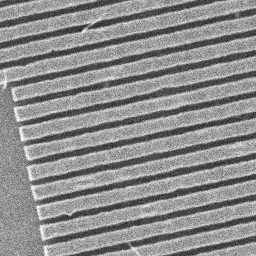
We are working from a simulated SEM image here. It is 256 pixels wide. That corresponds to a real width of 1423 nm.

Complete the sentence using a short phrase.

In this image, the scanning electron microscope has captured parallel lines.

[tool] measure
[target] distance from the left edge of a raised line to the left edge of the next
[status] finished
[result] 0.112 um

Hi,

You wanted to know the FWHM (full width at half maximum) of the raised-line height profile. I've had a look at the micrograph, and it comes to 13.3 px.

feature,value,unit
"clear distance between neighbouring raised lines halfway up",39.4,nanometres